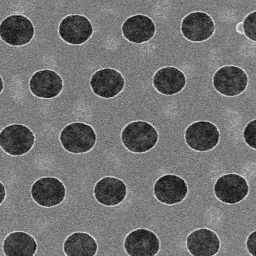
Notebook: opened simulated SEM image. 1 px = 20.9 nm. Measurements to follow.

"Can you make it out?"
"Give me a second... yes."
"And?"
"a regular array of holes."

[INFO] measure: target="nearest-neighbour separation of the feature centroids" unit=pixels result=60.7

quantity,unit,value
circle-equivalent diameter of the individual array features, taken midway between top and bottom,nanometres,664